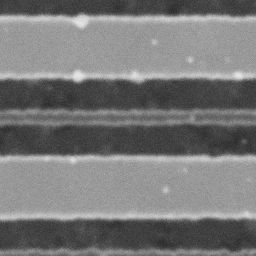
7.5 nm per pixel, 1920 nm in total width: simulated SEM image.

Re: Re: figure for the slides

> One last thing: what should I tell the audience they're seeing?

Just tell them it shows lines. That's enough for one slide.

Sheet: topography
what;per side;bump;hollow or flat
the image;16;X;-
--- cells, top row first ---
----------------
XXXXXXXXXXXXXXXX
XXXXXXXXXXXXXXXX
XXXXXXXXXXXXXXXX
XXXXXXXXXXXXXXXX
----------------
----------------
----------------
----------------
----------------
XXXXXXXXXXXXXXXX
XXXXXXXXXXXXXXXX
XXXXXXXXXXXXXXXX
XXXXXXXXXXXXXXXX
----------------
----------------